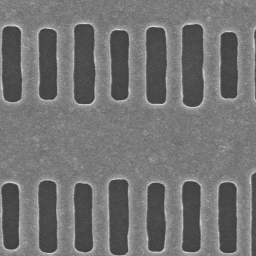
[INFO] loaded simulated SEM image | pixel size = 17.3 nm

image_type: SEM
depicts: a regular array of holes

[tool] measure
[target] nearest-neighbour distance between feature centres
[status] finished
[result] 624 nm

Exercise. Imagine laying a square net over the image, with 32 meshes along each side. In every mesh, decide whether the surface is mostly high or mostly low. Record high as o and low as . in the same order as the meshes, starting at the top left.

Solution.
oooooooooooooooooooooooooooooooo
oooooooooooooooooooooooooooooooo
oooooooooooooooooooooooooooooooo
o.ooooooo...ooooooo.ooo..ooooooo
...oo..oo...oo..oo...oo..ooo..oo
...oo..oo...oo..oo...oo..oo...oo
...oo..oo...oo..oo...oo..oo...oo
...oo..oo...oo..oo...oo..ooo..oo
...oo..oo...oo..oo...oo..ooo..oo
...oo..oo...oo..oo...oo..oo...oo
...oo..oo...oo..oo...oo...o...oo
...oo..oo...oo..oo...oo...oo..oo
o.ooooooo...oooooo...oo..ooooooo
oooooooooooooooooooooooooooooooo
oooooooooooooooooooooooooooooooo
oooooooooooooooooooooooooooooooo
oooooooooooooooooooooooooooooooo
oooooooooooooooooooooooooooooooo
oooooooooooooooooooooooooooooooo
oooooooooooooooooooooooooooooooo
oooooooooooooooooooooooooooooooo
oooooooooooooooooooooooooooooooo
oooooooooooooo.oooooooooooooooo.
..ooo..oo..ooo..oo...oo..oo...o.
..ooo..oo...oo..oo...oo..oo...o.
..ooo..oo...oo..oo...oo..oo...o.
..ooo..oo..ooo..oo...oo..oo...o.
..ooo..oo...oo..oo...oo..oo...o.
..ooo..oo...oo..oo...oo..oo...o.
..ooo..oo...oo..oo...oo..oo...o.
..ooo..oo...oo..oo...oo..oo...o.
oooooo.ooo.ooo..oooooooooooo.oo.